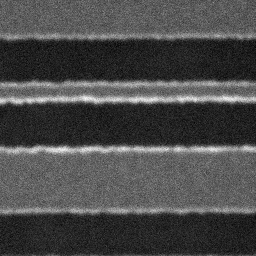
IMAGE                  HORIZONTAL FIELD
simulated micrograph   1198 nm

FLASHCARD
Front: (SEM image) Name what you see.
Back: lines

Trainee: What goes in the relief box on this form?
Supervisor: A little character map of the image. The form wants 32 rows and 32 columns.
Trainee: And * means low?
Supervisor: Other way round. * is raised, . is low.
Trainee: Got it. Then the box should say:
********************************
********************************
********************************
********************************
********************************
................................
................................
................................
................................
................................
*******.************************
********************************
**********..***********.**.*****
................................
................................
................................
................................
................................
.....*.....**..**..........*..**
********************************
********************************
********************************
********************************
********************************
********************************
********************************
**........*.....................
................................
................................
................................
................................
................................